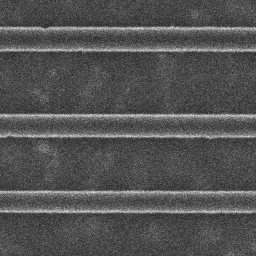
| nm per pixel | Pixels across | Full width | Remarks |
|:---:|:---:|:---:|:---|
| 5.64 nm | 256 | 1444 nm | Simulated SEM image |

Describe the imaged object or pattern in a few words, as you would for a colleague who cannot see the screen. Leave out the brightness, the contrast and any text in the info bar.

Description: one or a few lines or trenches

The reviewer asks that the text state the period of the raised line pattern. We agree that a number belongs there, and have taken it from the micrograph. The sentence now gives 460 nm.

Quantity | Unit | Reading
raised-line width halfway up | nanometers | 120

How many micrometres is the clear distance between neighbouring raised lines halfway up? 0.336